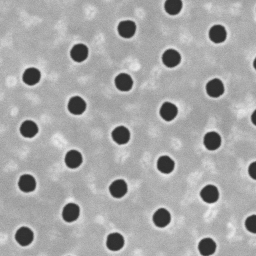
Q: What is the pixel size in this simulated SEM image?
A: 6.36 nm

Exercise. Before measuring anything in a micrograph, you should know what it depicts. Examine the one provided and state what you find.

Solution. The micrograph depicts a regular array of holes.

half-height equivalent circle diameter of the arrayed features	18.8	pixels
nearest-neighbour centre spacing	0.333	um